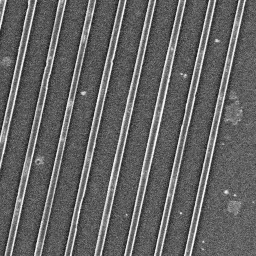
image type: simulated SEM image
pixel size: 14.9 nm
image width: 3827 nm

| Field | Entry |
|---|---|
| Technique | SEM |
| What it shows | parallel lines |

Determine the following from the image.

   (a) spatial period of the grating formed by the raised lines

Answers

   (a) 437 nanometers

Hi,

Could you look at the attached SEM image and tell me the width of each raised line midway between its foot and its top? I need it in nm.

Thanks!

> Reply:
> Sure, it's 89.5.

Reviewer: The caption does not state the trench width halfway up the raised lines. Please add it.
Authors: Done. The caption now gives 347 nm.